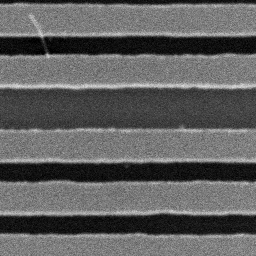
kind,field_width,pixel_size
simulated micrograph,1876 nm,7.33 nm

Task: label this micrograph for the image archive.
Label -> lines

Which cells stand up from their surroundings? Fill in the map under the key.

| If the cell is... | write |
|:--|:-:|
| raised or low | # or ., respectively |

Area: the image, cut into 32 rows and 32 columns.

.####...#.#..................#..
################################
################################
################################
#############........###.######.
................................
................................
################################
################################
################################
################################
................................
................................
................................
................................
................................
################################
################################
################################
################################
................................
................................
................................
################################
################################
################################
################################
................................
................................
################################
################################
################################